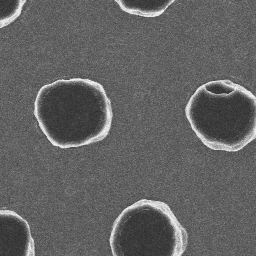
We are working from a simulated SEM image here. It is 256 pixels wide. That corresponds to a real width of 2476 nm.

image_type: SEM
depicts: raised bodies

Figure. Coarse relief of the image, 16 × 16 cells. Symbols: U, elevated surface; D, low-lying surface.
UDDDDDDDUUDDDDDD
DDDDDDDDDDDDDDDD
DDDDDDDDDDDDDDDD
DDDDDDDDDDDDDDDD
DDDDDDDDDDDDDDDD
DDDUUUDDDDDDDUUD
DDUUUUUDDDDDUUUU
DDUUUUUDDDDDUUUU
DDDUUUDDDDDDUUUU
DDDDDDDDDDDDDDDD
DDDDDDDDDDDDDDDD
DDDDDDDDDDDDDDDD
DDDDDDDDDDDDDDDD
UDDDDDDDUUUDDDDD
UUDDDDDUUUUDDDDD
UUDDDDDUUUUDDDDD